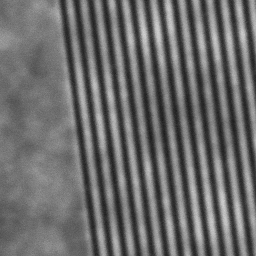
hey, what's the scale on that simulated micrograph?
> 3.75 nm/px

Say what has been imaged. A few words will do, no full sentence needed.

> parallel lines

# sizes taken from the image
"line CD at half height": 24.2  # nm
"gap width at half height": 27.9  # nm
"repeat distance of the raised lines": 0.0523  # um